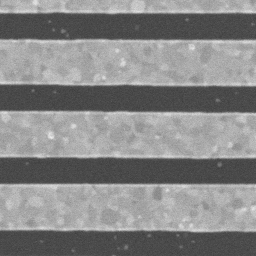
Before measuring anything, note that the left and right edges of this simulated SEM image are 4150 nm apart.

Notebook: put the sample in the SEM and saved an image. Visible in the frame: lines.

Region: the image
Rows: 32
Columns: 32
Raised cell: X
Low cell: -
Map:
XXXXXXXXXXXXXXXXXXXXXXXXXXXXXXXX
XXXXXX--XXXXXXXXXXXXXXXXXXXXX-XX
--------------------------------
--------------------------------
--------------------------------
XXXXXXXXXXXXXXXXXXXXXXXXXXXXXXXX
XXXXXXXXXXXXXXXXXXXXXXXXXXXXXXXX
XXXXXXXXXXXXXXXXXXXXXXXXXXXXXXXX
XXXXXXXXXXXXXXXXXXXXXXXXXXXXXXXX
XXXXXXXXXXXXXXXXXXXXXXXXXXXXXXXX
-------XXXXXXXX-XXXXXXXXXXXXXXXX
--------------------------------
--------------------------------
--------------------------------
XXXXXXXXXXXXXXXXXXXXXXXXXXXXXXXX
XXXXXXXXXXXXXXXXXXXXXXXXXXXXXXXX
XXXXXXXXXXXXXXXXXXXXXXXXXXXXXXXX
XXXXXXXXXXXXXXXXXXXXXXXXXXXXXXXX
XXXXXXXXXXXXXXXXXXXXXXXXXXXXXXXX
XXXXXXXXXXXXXXXXXXXXXXXXXXXXXXXX
--------------------------------
--------------------------------
--------------------------------
XXXXXXXXXXXXXXXXXXXXXXXXXXXXXXXX
XXXXXXXXXXXXXXXXXXXXXXXXXXXXXXXX
XXXXXXXXXXXXXXXXXXXXXXXXXXXXXXXX
XXXXXXXXXXXXXXXXXXXXXXXXXXXXXXXX
XXXXXXXXXXXXXXXXXXXXXXXXXXXXXXXX
XXXXXXXXXXXXXXXXXXXXXXXXXXXXXXXX
--------------------------------
--------------------------------
--------------------------------